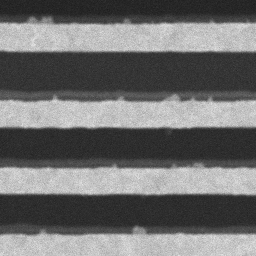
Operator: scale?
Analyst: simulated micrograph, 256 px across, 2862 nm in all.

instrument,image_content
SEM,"lines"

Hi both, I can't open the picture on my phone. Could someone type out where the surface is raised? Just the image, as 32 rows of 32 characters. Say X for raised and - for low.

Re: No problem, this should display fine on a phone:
--------------------------------
--------------------------------
----XXX-------------------------
XXXXXXXXXXXXXXXXXXXXXXXXXXXXXXXX
XXXXXXXXXXXXXXXXXXXXXXXXXXXXXXXX
XXXXXXXXXXXXXXXXXXXXXXXXXXXXXXXX
--------------------------------
--------------------------------
--------------------------------
--------------------------------
--------------------------------
--------------------------------
------XX------XX----XXX---X-----
XXXXXXXXXXXXXXXXXXXXXXXXXXXXXXXX
XXXXXXXXXXXXXXXXXXXXXXXXXXXXXXXX
XXXXXXXXXXXXXXXXXXXXXXXXXXXXXXXX
--------------------------------
--------------------------------
--------------------------------
--------------------------------
--------------------------------
XXXXXXXXXXXXXXXXXXXXXXXXXXXXXXXX
XXXXXXXXXXXXXXXXXXXXXXXXXXXXXXXX
XXXXXXXXXXXXXXXXXXXXXXXXXXXXXXXX
--------------------------------
--------------------------------
--------------------------------
--------------------------------
-----------------X--------------
XXXXXXXX--XXXXXXXXXXXXXXXXXXXXXX
XXXXXXXXXXXXXXXXXXXXXXXXXXXXXXXX
XXXXXXXXXXXXXXXXXXXXXXXXXXXXXXXX